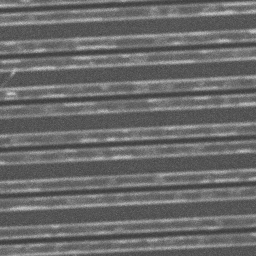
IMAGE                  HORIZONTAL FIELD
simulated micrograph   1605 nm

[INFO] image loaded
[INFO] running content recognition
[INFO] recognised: parallel lines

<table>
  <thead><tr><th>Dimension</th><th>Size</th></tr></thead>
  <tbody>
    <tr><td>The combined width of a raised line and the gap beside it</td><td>146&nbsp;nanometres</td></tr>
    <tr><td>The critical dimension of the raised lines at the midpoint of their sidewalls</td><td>72.7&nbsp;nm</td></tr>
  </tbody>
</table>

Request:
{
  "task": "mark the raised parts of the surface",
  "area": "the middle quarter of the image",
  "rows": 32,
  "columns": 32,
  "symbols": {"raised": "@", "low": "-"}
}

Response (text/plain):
@@@@@@@@@@----------------------
--------------------------------
--------------------------------
--------------------------------
----------------------@@@@@@@@@@
@-@@@@@@@@@@@@@@@@@@@@@@@@@@@@@@
@@@@@@@@@@@@@@@@@@@@@@@@@@@@@@@@
@@@@@@@@@@@@--------------------
------------------------------@@
----------@@@@@@@@@@@@@@@@@@@@@@
@@@@@@@@@@@@@@@@@@@@@@@@@@@@@@@@
@@@@@@@@@@@@@@@@@@@@-@----------
--------------------------------
--------------------------------
--------------------------------
--------------------------------
------------@@@@@@@@@@@@@@@@@@@@
@@@@@@@@@@@@@@@@@@@@@@@@@@@@@@@@
@@@@@@@@@@@@@@@@@@@@@@@@@@@-----
@@@@@@@-------------------------
------------------------@@@@@@@@
@@--@@@@@@@@@@@@@@@@@@@@@@@@@@@@
@@@@@@@@@@@@@@@@@@@@@@@@@@@@@@@@
@@@@@@@@@@@@@@@-----------------
--------------------------------
--------------------------------
--------------------------------
-----------------------@@@@@@@@@
---@@@@@@@@@@@@@@@@@@@@@@@@@@@@@
@@@@@@@@@@@@@@@@@@@@@@@@@@@@@@@@
@@@@@@@@@@@@@@@@@---------------
--------------------------------